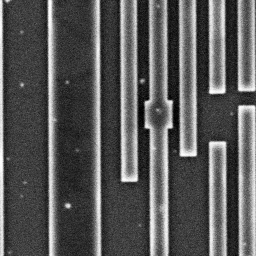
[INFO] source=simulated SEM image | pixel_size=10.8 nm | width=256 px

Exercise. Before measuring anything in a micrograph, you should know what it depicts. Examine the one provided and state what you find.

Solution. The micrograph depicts wiring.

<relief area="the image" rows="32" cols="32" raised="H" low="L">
LLLLLLHHHHHHLLLHHLLHHLHHLLHHLLHH
LLLLLLHHHHHHLLLHHLLHHLHHLLHHLLHH
LLLLLLHHHHHHLLLHHLLHHLHHLLHHLLHH
LLLLLLHHHHHHLLLHHLLHHLHHLLHHLLHH
LLLLLLHHHHHHLLLHHLLHHLHHLLHHLLHH
LLLLLLHHHHHHLLLHHLLHHLHHLLHHLLHH
LLLLLLHHHHHHLLLHHLLHHLHHLLHHLLHH
LLLLLLHHHHHHLLLHHLLHHLHHLLHHLLHH
LLLLLLHHHHHHLLLHHLLHHLLHLLHHLLHH
LLLLLLHHHHHHLLLHHLLHHLLHLLHHLLHH
LLLLLLHHHHHHLLLHHLLHHLLHLLHHLLHH
LLLLLLHHHHHHLLLHHLLHHLLHLLHHLLLL
LLLLLLHHHHHHLLLHHLLHHLLHLLLLLLLL
LLLLLLHHHHHHLLLHHLHHHLLHLLLLLLHH
LLLLLLHHHHHHLLLHHLHHHLLHLLLLLLHH
LLLLLLHHHHHHLLLHHLHHHLLHLLLLLLHH
LLLLLLHHHHHHLLLHHLLHHLLHLLLLLLHH
LLLLLLHHHHHHLLLHHLLHHLLHLLLLLLHH
LLLLLLHHHHHHLLLHHLLHHLLHLLHHLLHH
LLLLLLHHHHHHLLLHHLLHHLLLLLHHLLHH
LLLLLLHHHHHHLLLHHLLHHLLLLLHHLLHH
LLLLLLHHHHHHLLLHHLLHHLLLLLHHLLHH
LLLLLLHHHHHHLLLLHLLHHLLLLLHHLLHH
LLLLLLHHHHHHLLLLLLLHHLLLLLHHLLHH
LLLLLLHHHHHHHLLLLLLHHLLLLLHHLLHH
LLLLLLHHHHHHHLLLLLLHHLLLLLHHLLHH
LLLLLLHHHHHHHLLLLLLHHLLLLLHHLLHH
LLLLLLHHHHHHHLLLLLLHHLLLLLHHLLHH
LLLLLLHHHHHHHLLLLLLHHLLLLLHHLLHH
LLLLLLHHHHHHHLLLLLLHHLLLLLHHLLHH
LLLLLLHHHHHHHLLLLLLHHLLLLLHHLLHH
LLLLLLHHHHHHHLLLLLLHHLLLLLHHLLHH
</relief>